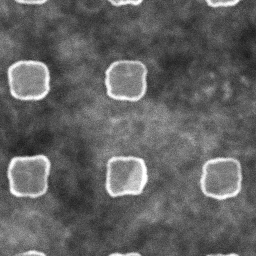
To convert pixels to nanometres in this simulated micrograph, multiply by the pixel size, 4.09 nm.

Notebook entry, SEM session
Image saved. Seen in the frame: raised bodies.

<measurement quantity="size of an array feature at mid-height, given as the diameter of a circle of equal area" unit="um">0.169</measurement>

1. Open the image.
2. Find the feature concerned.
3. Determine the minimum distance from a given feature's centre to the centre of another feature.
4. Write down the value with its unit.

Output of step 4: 392 nanometers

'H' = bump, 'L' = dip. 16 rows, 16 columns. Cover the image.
LLLLLLLLLLLLLLLL
LLLLLLLLLLLLLLLL
LLLLLLLLLLLLLLLL
LLLLLLLLLLLLLLLL
LHHLLLLHHLLLLLLL
LHHLLLLHHLLLLLLL
LLLLLLLLLLLLLLLL
LLLLLLLLLLLLLLLL
LLLLLLLLLLLLLLLL
LLLLLLLLLLLLLLLL
LHHLLLLHHLLLLHHL
LHHLLLLHHLLLLHHL
LLLLLLLLLLLLLLLL
LLLLLLLLLLLLLLLL
LLLLLLLLLLLLLLLL
LLLLLLLLLLLLLLLL